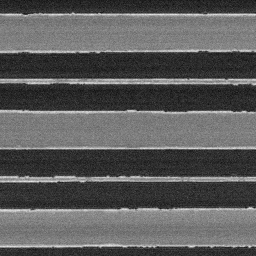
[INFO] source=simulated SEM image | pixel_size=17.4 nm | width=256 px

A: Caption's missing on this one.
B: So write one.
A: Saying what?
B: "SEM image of lines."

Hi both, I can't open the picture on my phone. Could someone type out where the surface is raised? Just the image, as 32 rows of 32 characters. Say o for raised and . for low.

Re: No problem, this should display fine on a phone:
................................
................................
oooooooooooooooooooooooooooooooo
oooooooooooooooooooooooooooooooo
oooooooooooooooooooooooooooooooo
oooooooooooooooooooooooooooooooo
................................
................................
................................
................................
................................
................................
................................
................................
oooooooooooooooooooooooooooooooo
oooooooooooooooooooooooooooooooo
oooooooooooooooooooooooooooooooo
oooooooooooooooooooooooooooooooo
oooooooo.....ooooooo.....ooo....
................................
................................
................................
ooooo...o......oo...............
................................
................................
................................
oooooooooooooooooooooooooooooooo
oooooooooooooooooooooooooooooooo
oooooooooooooooooooooooooooooooo
oooooooooooooooooooooooooooooooo
oooooooooooooooooooooooooooooooo
................................